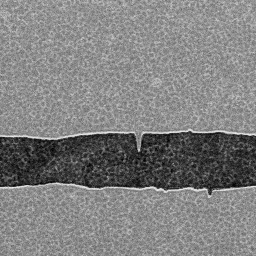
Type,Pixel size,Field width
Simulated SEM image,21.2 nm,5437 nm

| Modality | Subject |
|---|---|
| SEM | one or a few lines or trenches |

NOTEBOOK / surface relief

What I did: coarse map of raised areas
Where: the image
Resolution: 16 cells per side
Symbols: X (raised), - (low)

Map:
XXXXXXXXXXXXXXXX
XXXXXXXXXXXXXXXX
XXXXXXXXXXXXXXXX
XXXXXXXXXXXXXXXX
XXXXXXXXXXXXXXXX
XXXXXXXXXXXXXXXX
XXXXXXXXXXXXXXXX
XXXXXXXXXXXXXXXX
XXXXX---X-------
----------------
----------------
---X------------
XXXXXXXXXXXXXXXX
XXXXXXXXXXXXXXXX
XXXXXXXXXXXXXXXX
XXXXXXXXXXXXXXXX